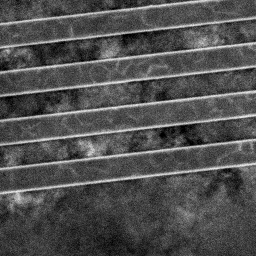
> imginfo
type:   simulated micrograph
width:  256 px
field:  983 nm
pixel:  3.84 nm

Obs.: parallel lines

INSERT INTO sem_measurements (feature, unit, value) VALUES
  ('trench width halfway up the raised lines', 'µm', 0.0893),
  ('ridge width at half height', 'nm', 96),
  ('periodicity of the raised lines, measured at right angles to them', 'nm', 185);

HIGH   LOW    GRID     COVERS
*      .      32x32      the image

.....................***********
............********************
....***************************.
**********************..........
*************...................
****..........................**
......................**********
.............*******************
....**************************..
**********************..........
*************...................
****...........................*
......................**********
..............******************
.....***************************
***********************.........
***************.................
******.........................*
.......................*********
..............******************
.....***************************
************************........
***************.................
******..........................
................................
................................
................................
................................
................................
................................
................................
................................